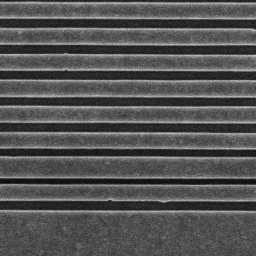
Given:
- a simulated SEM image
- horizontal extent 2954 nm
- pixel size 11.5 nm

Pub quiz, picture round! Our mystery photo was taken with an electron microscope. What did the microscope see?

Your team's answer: parallel lines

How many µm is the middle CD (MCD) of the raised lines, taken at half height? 0.193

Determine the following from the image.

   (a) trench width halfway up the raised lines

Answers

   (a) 107 nanometers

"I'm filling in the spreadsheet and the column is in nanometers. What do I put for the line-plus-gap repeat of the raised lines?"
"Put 300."